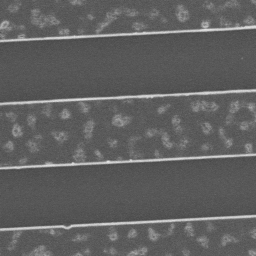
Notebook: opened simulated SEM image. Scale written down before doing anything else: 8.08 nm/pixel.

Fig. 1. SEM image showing one or a few lines or trenches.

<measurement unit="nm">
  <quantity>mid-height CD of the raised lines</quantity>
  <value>521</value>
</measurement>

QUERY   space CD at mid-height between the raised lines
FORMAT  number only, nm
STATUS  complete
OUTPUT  505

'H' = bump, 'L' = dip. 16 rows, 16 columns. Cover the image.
HHHHHHHHHHHHHHHH
HHHHHHHHHHHHHHHH
HLLLLLLLLLLLLLLL
LLLLLLLLLLLLLLLL
LLLLLLLLLLLLLLLL
LLLLLLLLLLLLLLLL
HHHHHHHHHHHHHHHH
HHHHHHHHHHHHHHHH
HHHHHHHHHHHHHHHH
HHHHHHHHHHHHHHHH
LLLLLLLLLLLLLLLL
LLLLLLLLLLLLLLLL
LLLLLLLLLLLLLLLL
LLLLLLLLLLLLLLLL
HHHHHHHHHHHHHHHH
HHHHHHHHHHHHHHHH